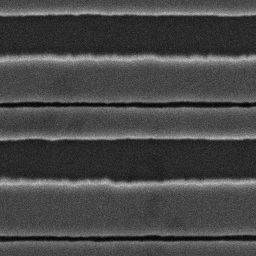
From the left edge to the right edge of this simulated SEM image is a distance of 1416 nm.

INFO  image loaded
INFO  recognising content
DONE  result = lines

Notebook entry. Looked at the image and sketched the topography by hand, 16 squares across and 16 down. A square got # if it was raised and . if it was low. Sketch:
################
................
................
................
################
################
################
################
################
................
................
#######..#######
################
################
################
################